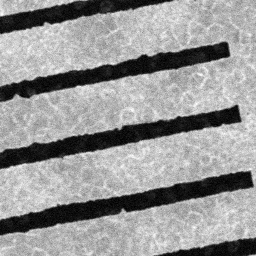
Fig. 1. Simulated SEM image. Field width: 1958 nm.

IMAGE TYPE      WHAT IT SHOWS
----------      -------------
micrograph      one or a few lines or trenches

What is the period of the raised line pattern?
503 nanometres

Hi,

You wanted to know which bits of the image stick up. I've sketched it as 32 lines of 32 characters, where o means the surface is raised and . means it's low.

oooooooo.....o......oooooooooooo
ooo..........o.ooooooooooooooooo
.........ooooooooooooooooooooooo
....oooooooooooooooooooooooooooo
oooooooooooooooooooooooooooooooo
ooooooooooooooooooooooooooo..ooo
ooooooooooooooooooooo........ooo
oooooooooooooooo...........ooooo
oooooooooooo...........ooooooooo
oooooo...........ooooooooooooooo
o...........oooooooooooooooooooo
.......ooooooooooooooooooooooooo
.ooooooooooooooooooooooooooooooo
oooooooooooooooooooooooooooo..oo
oooooooooooooooooooooo........oo
ooooooooooooooooo............ooo
oooooooooooo............oooooooo
ooooooo...........oooooooooooooo
o.............oooooooooooooooooo
........oooooooooooooooooooooooo
...ooooooooooooooooooooooooooooo
ooooooooooooooooooooooooooooo..o
ooooooooooooooooooooooooo.......
oooooooooooooooooooo...........o
ooooooooooooooo...........oooooo
ooooooo...............oooooooooo
oooo...........o.ooooooooooooooo
...........ooooooooooooooooooooo
......oooooooooooooooooooooooooo
oooooooooooooooooooooooooooooooo
oooooooooooooooooooooooooo......
ooooooooooooooooooooo...........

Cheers